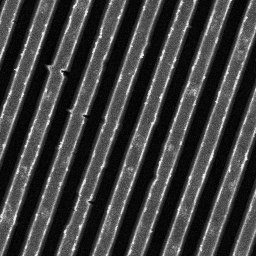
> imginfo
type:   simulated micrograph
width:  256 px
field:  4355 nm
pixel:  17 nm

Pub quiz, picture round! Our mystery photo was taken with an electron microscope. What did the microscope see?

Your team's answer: parallel lines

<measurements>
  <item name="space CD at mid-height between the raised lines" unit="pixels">16.5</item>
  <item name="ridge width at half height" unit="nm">281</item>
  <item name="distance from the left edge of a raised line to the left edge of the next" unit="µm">0.563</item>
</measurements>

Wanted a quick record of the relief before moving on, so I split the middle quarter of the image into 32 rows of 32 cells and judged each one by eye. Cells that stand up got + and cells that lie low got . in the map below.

+.....++++.....++++....+++++....
+....+++++....++++.....++++.....
.....++++.....++++....+++++....+
.....++++.....++++....++++.....+
....+++++....++++.....++++.....+
....+++++....++++....+++++....++
....++++....+++++....++++.....++
...+++++....++++.....++++....+++
...++++.....++++.....++++....+++
..+++++....+++++....+++++....+++
..+++++....++++.....++++....++++
.+++++.....++++.....++++....++++
.+++++....+++++....+++++....++++
.++++.....++++.....++++....+++++
.++++.....++++.....++++....++++.
+++++....+++++....+++++....++++.
++++.....++++.....++++....+++++.
++++.....++++....+++++....++++..
++++....+++++....++++.....++++..
+++.....++++.....++++....+++++..
+++.....++++....+++++....+++++..
+++....++++.....++++.....++++...
++.....++++....+++++....+++++...
++.....++++....+++++....+++++...
++....++++.....++++.....++++....
+.....++++....+++++....+++++....
+.....++++....+++++....++++.....
+....++++.....++++.....++++....+
.....++++....+++++.....++++....+
.....++++....+++++....++++.....+
....++++.....++++....+++++....++
....++++....+++++....++++.....++